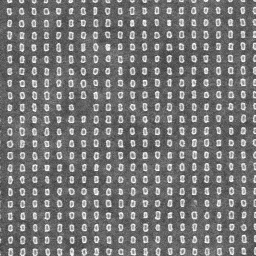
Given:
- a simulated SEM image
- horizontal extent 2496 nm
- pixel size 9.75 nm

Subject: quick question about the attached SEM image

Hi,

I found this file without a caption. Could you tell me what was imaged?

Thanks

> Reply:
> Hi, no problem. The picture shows a regular array of raised bodies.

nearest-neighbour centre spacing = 115 nanometres